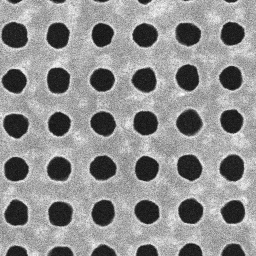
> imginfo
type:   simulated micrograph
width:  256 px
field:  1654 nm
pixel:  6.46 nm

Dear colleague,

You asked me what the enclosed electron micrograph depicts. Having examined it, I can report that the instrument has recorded a regular array of holes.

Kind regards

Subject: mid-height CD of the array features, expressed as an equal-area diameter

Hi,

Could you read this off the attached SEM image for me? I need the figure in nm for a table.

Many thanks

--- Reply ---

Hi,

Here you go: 157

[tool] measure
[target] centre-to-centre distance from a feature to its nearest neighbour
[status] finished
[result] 278 nm